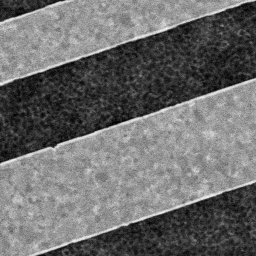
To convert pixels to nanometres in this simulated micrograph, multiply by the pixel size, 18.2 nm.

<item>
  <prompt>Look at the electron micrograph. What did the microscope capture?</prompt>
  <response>one or a few lines or trenches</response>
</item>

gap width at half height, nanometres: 1390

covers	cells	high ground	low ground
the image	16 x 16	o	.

...ooooooooooo..
ooooooooooo.....
oooooooo........
ooooo...........
oo..............
..............oo
...........ooooo
........oooooooo
.....ooooooooooo
..oooooooooooooo
oooooooooooooooo
ooooooooooooooo.
oooooooooooo....
ooooooooo.......
oooooo..........
ooo.............